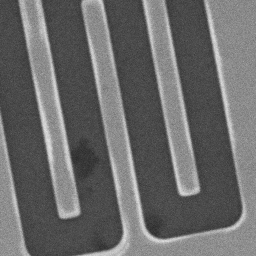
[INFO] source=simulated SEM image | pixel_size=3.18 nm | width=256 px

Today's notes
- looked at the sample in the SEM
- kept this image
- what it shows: groups of lines, slits or small figures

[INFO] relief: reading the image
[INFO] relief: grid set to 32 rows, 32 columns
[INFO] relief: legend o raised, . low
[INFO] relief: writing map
..ooo.....ooo.....ooo.....oooooo
...oo.....ooo.....ooo.....oooooo
...oo......oo.....ooo.....oooooo
...ooo.....oo......oo.....oooooo
...ooo.....ooo.....oo.....oooooo
...ooo.....ooo.....oo......ooooo
....oo......oo.....ooo.....ooooo
....oo......oo.....ooo.....ooooo
....ooo.....oo.....ooo.....ooooo
....ooo.....ooo.....oo......oooo
....ooo.....ooo.....ooo.....oooo
.....oo.....ooo.....ooo.....oooo
.....oo.....ooo.....ooo.....oooo
.....oo......oo.....ooo.....oooo
.....ooo.....oo......oo.....oooo
.....ooo.....ooo.....oo......ooo
......oo.....ooo.....ooo.....ooo
o.....oo.....ooo.....ooo.....ooo
o.....oo......oo.....ooo.....ooo
o.....ooo.....oo......oo.....ooo
o.....ooo.....oo......oo.....ooo
o.....ooo.....ooo.....ooo.....oo
oo.....oo.....ooo.....ooo.....oo
oo.....oo......oo.....ooo.....oo
oo.....ooo.....oo.............oo
oo.....ooo.....oo.............oo
oo.....ooo.....ooo............oo
oo.............ooo............oo
ooo.............oo..........oooo
ooo.............ooo....ooooooooo
ooo............ooooooooooooooooo
ooo...........oooooooooooooooooo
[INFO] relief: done